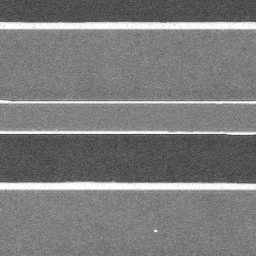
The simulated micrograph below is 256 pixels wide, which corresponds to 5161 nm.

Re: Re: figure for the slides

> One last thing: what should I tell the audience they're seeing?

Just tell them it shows lines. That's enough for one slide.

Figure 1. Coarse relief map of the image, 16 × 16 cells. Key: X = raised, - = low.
----------------
----------------
XXXXXXXXXXXXXXXX
XXXXXXXXXXXXXXXX
XXXXXXXXXXXXXXXX
XXXXXXXXXXXXXXXX
XXXXXXXXXXXXXXXX
XXXXXXXXXXXXXXXX
----------------
----------------
----------------
----------------
XXXXXXXXXXXXXXXX
XXXXXXXXXXXXXXXX
XXXXXXXXXXXXXXXX
XXXXXXXXXXXXXXXX